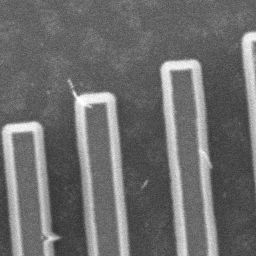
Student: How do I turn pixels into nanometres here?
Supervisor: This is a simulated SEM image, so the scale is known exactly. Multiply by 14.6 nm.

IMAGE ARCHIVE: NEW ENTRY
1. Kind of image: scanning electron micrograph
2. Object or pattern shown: one or a few lines or trenches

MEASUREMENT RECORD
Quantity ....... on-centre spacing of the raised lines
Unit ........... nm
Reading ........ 1200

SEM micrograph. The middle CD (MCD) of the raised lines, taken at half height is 0.473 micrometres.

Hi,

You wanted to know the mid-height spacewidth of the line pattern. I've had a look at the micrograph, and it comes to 760 nanometres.